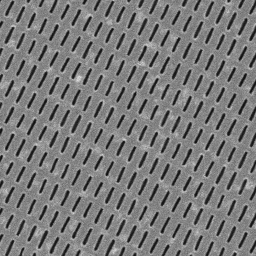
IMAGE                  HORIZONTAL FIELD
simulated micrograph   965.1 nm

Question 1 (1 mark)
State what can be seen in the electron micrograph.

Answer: a regular array of holes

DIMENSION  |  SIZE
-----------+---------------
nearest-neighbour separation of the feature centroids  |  47.3 nm